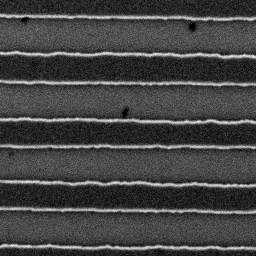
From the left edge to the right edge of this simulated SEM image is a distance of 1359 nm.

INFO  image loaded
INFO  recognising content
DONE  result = lines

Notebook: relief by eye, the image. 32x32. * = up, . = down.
********************************
********************************
................................
................................
................................
................................
................................
********************************
********************************
********************************
..................*.....********
................................
................................
................................
................................
********************************
********************************
********************************
...........................**...
................................
................................
................................
................................
********************************
********************************
********************************
.....................*..********
................................
................................
................................
................................
********************************